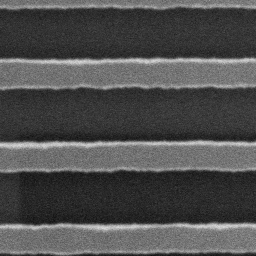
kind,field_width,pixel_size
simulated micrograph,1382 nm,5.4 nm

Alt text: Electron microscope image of lines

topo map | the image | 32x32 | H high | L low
HHHHHHHHHHHHHHHHHHHHHHHHHHHHHHHH
LLLLLLLLLLLLLLLLLLLLLLLLLLLLLLLL
LLLLLLLLLLLLLLLLLLLLLLLLLLLLLLLL
LLLLLLLLLLLLLLLLLLLLLLLLLLLLLLLL
LLLLLLLLLLLLLLLLLLLLLLLLLLLLLLLL
LLLLLLLLLLLLLLLLLLLLLLLLLLLLLLLL
LLLLLLLLLLLLLLLLLLLLLLLLLLLLLLLL
HHHLLLHLLLHLHHHHHHHHHHHHHHHHHHHH
HHHHHHHHHHHHHHHHHHHHHHHHHHHHHHHH
HHHHHHHHHHHHHHHHHHHHHHHHHHHHHHHH
HHHHHHHHHHHHHHHHHHHHHHHHHHHHHHHH
LLLLLLLLLLLLLLLLLLLLLLLLLLLLLLLL
LLLLLLLLLLLLLLLLLLLLLLLLLLLLLLLL
LLLLLLLLLLLLLLLLLLLLLLLLLLLLLLLL
LLLLLLLLLLLLLLLLLLLLLLLLLLLLLLLL
LLLLLLLLLLLLLLLLLLLLLLLLLLLLLLLL
LLLLLLLLLLLLLLLLLLLLLLLLLLLLLLLL
LLLLLLLLLLLLLLLLLLLLLLLLLLLLLLLL
HHHHHHHHHHHHHHHHHHHHHHHHHHHHHHHH
HHHHHHHHHHHHHHHHHHHHHHHHHHHHHHHH
HHHHHHHHHHHHHHHHHHHHHHHHHHHHHHHH
LLLLLLLLLLLLLLLLLLLLLLLLLLLLLLLL
LLLLLLLLLLLLLLLLLLLLLLLLLLLLLLLL
LLLLLLLLLLLLLLLLLLLLLLLLLLLLLLLL
LLLLLLLLLLLLLLLLLLLLLLLLLLLLLLLL
LLLLLLLLLLLLLLLLLLLLLLLLLLLLLLLL
LLLLLLLLLLLLLLLLLLLLLLLLLLLLLLLL
LLLLLLLLLLLLLLLLLLLLLLLLLLLLLLLL
HHHHHHHHHHHHHHHHHHHHHHHHHHHHHHHH
HHHHHHHHHHHHHHHHHHHHHHHHHHHHHHHH
HHHHHHHHHHHHHHHHHHHHHHHHHHHHHHHH
HHHHHHHHHHHHHHHHHHHHHHHHHHLLLHHL